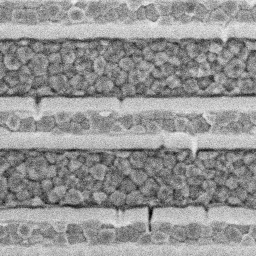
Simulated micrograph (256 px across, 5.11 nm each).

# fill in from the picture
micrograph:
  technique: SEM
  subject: one or a few lines or trenches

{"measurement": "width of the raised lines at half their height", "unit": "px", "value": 38.6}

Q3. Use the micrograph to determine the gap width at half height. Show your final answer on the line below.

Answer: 72.1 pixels